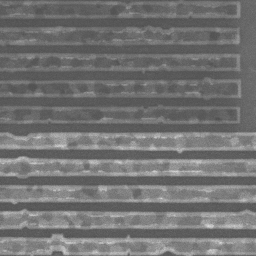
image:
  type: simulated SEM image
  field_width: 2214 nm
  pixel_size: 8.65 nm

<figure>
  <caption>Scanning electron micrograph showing parallel lines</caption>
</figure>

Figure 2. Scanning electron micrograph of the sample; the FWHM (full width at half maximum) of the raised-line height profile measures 124 nanometers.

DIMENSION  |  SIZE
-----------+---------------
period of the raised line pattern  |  228 nm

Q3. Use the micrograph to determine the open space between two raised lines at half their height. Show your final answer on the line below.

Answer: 0.107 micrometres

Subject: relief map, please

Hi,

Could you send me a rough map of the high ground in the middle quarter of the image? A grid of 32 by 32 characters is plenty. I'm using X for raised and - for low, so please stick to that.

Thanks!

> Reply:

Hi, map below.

XXXXXXXXXXXXXXXXXXXXXXXXXXXXXXXX
--------------------------------
--------------------------------
--------------------------------
--------------------------------
XXXXXXXXXXXXXXXXXXXXXXXXXXXXXXXX
XXXXXXXXXXXXXXXXXXXXXXXXXXXXXXXX
XXXXXXXXXXXXXXXXXXXXXXXXXXXXXXXX
--------------------------------
--------------------------------
--------------------------------
XXXXXXXXXXXXXXXXXXXXXXXXXXXXXXXX
XXXXXXXXXXXXXXXXXXXXXXXXXXXXXXXX
XXXXXXXXXXXXXXXXXXXXXXXXXXXXXXXX
-------------------------XXXXXXX
--------------------------------
--------------------------------
------------------------------XX
XXXXXXXXXXXXXXXXXXXXXXXXXXXXXXXX
XXXXXXXXXXXXXXXXXXXXXXXXXXXXXXXX
XXXXXXXXXXXXXXXXXXXXXXXXXXXXXXXX
----------------------------XX--
--------------------------------
--------------------------------
XXXXXXXXXXXXXXXXXXXXXXXXXXXXXXXX
XXXXXXXXXXXXXXXXXXXXXXXXXXXXXXXX
XXXXXXXXXXXXXXXXXXXXXXXXXXXXXXXX
XXXXXXXXXXXXXXXXXXXXXXXXXXXXXXXX
--------------------------------
--------------------------------
--------------------------------
XXXXXXXXXXXXXXXXXXXXXXXXXXXXXXXX